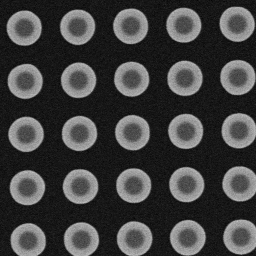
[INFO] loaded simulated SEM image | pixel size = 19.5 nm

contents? an array of small figures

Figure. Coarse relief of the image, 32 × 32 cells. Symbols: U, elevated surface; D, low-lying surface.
DDDDDDDDDDDDDDDDDDDDDDDDDDDDDDDD
DDUUDDDDDUUDDDDUUUDDDDUUDDDDUUUD
DUUUUDDDUUUUDDUUUUDDDUUUUDDDUUUU
DUUUUDDDUUUUDDUUUUDDDUUUUDDDUUUU
DUUUUDDDUUUDDDDUUUDDDUUUUDDDUUUD
DDUUDDDDDUDDDDDDDDDDDDDDDDDDDDDD
DDDDDDDDDDDDDDDDDDDDDDDDDDDDDDDD
DDDDDDDDDDDDDDDDDDDDDDDDDDDDDDDD
DDUUUDDDUUUDDDDUUUDDDUUUUDDDUUUU
DUUUUDDDUUUUDDUUUUUDDUUUUDDDUUUU
DUUUUDDDUUUUDDUUUUUDDUUUUDDDUUUU
DUUUUDDDUUUDDDDUUUDDDDUUDDDDDUUD
DDDDDDDDDDDDDDDDDDDDDDDDDDDDDDDD
DDDDDDDDDDDDDDDDDDDDDDDDDDDDDDDD
DDDDDDDDDDDDDDDDUDDDDDUUDDDDDUUD
DDUUUDDDUUUUDDDUUUDDDUUUUDDDUUUU
DUUUUDDDUUUUDDUUUUUDDUUUUDDDUUUU
DUUUUDDDUUUUDDDUUUUDDUUUUDDDUUUU
DDUUUDDDDUUDDDDDUUDDDDDUDDDDDDDD
DDDDDDDDDDDDDDDDDDDDDDDDDDDDDDDD
DDDDDDDDDDDDDDDDDDDDDDDDDDDDDDDD
DDDUDDDDDUUDDDDUUUDDDDUUUDDDUUUU
DDUUUDDDUUUUDDDUUUUDDUUUUDDDUUUU
DUUUUUDDUUUUDDDUUUUDDUUUUDDDUUUU
DDUUUDDDUUUUDDDUUUDDDDUUUDDDUUUU
DDDUDDDDDDDDDDDDDDDDDDDDDDDDDDDD
DDDDDDDDDDDDDDDDDDDDDDDDDDDDDDDD
DDDDDDDDDDDDDDDDDDDDDDDDDDDDDDUD
DDUUUDDDDUUUDDDUUUUDDDUUUDDDUUUU
DUUUUUDDUUUUDDDUUUUDDUUUUUDDUUUU
DUUUUUDDUUUUDDDUUUUDDUUUUDDDUUUU
DDUUUDDDDUUUDDDUUUDDDDUUUDDDDUUD